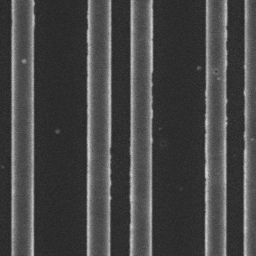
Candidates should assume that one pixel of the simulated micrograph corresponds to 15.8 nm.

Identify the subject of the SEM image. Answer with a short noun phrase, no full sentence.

lines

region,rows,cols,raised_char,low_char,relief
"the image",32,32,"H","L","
LLHHLLLLLLLHHHLLHHHLLLLLLLHHLLLH
LLHHLLLLLLLHHHLLHHHLLLLLLLHHLLLH
LLHHLLLLLLLHHHLLHHHLLLLLLLHHLLLH
LLHHLLLLLLLHHHLLHHHLLLLLLLHHLLLH
LLHHLLLLLLLHHHLLHHHLLLLLLLHHLLLH
LLHHLLLLLLLHHHLLHHHLLLLLLLHHLLLH
LLHHLLLLLLLHHHLLHHHLLLLLLLHHLLLH
LLHHLLLLLLLHHHLLHHHLLLLLLLHHLLLH
LLHHLLLLLLLHHHLLHHHLLLLLLLHHLLLH
LLHHLLLLLLLHHHLLHHHLLLLLLLHHLLLH
LLHHLLLLLLLHHHLLHHHLLLLLLLHHLLLH
LLHHLLLLLLLHHHLLHHHLLLLLLLHHLLLH
LLHHLLLLLLLHHHLLHHHLLLLLLLHHLLLH
LLHHLLLLLLLHHHLLHHHLLLLLLLHHLLLH
LLHHLLLLLLLHHHLLHHHLLLLLLLHHLLLH
LLHHLLLLLLLHHHLLHHHLLLLLLLHHLLLH
LLHHLLLLLLLHHHLLHHHLLLLLLLHHLLLH
LLHHLLLLLLLHHHLLHHHLLLLLLLHHLLLH
LLHHLLLLLLLHHHLLHHHLLLLLLLHHLLLH
LLHHLLLLLLLHHHLLHHHLLLLLLLHHLLLH
LLHHLLLLLLLHHHLLHHHLLLLLLLHHLLLH
LLHHLLLLLLLHHHLLHHHLLLLLLLHHLLLH
LLHHLLLLLLLHHHLLHHHLLLLLLLHHLLLH
LLHHLLLLLLLHHHLLHHHLLLLLLLHHLLLH
LLHHLLLLLLLHHHLLHHHLLLLLLLHHLLLH
LLHHLLLLLLLHHHLLHHHLLLLLLLHHLLLH
LLHHLLLLLLLHHHLLHHHLLLLLLLHHLLLH
LLHHLLLLLLLHHHLLHHHLLLLLLLHHLLLH
LLHHLLLLLLLHHHLLHHHLLLLLLLHHLLLH
LLHHLLLLLLLHHHLLHHHLLLLLLLHHLLLH
LLHHLLLLLLLHHHLLHHHLLLLLLLHHLLLH
LLHHLLLLLLLHHHLLHHHLLLLLLLHHLLLH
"